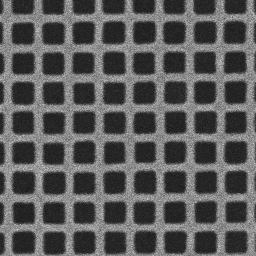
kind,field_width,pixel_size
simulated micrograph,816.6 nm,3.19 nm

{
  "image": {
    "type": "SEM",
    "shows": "a regular array of holes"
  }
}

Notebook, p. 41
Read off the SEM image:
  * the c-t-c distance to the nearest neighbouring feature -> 0.0944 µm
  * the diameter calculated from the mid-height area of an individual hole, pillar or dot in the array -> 80.4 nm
